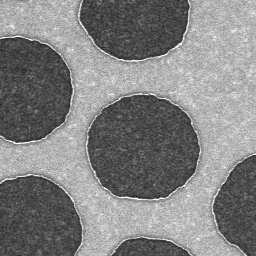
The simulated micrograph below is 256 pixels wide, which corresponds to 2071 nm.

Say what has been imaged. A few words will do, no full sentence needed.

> raised bodies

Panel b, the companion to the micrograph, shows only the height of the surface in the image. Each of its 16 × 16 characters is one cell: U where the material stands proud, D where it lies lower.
DDDDDUUUUUUUDDDD
DDDDDUUUUUUUDDDD
UUDDDDUUUUUDDDDD
UUUUDDDUUUDDDDDD
UUUUDDDDDDDDDDDD
UUUUUDDDDDDDDDDD
UUUUDDDUUUUDDDDD
UUUUDDUUUUUUDDDD
UUUDDUUUUUUUDDDD
DDDDDUUUUUUUDDDD
DDDDDDUUUUUUDDDU
UUUUDDUUUUUUDDUU
UUUUDDDDDDDDDUUU
UUUUUDDDDDDDDUUU
UUUUUDDDDDDDDDUU
UUUUUDDUUUUDDDDU